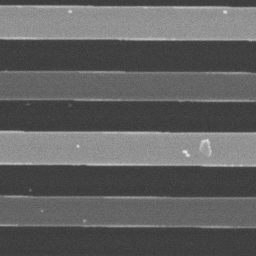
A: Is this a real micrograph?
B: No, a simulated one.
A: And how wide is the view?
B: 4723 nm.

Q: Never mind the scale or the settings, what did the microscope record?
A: lines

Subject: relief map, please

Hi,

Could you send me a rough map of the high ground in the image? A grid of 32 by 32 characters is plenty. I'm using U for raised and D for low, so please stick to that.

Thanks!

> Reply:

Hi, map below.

DDDDDDDDDDDDDDDDDDDDDDDDDDDDDDDD
UUUUUUUUUUUUUUUUUUUUUUUUUUUUUUUU
UUUUUUUUUUUUUUUUUUUUUUUUUUUUUUUU
UUUUUUUUUUUUUUUUUUUUUUUUUUUUUUUU
UUUUUUUUUUUUUUUUUUUUUUUUUUUUUUUU
DDDDDDDDDDDDDDDDDDDDDDDDDDDDDDDD
DDDDDDDDDDDDDDDDDDDDDDDDDDDDDDDD
DDDDDDDDDDDDDDDDDDDDDDDDDDDDDDDD
DDDDDDDDDDDDDDDDDDDDDDDDDDDDDDDD
UUUUUUUUUUUUUUUUUUUUUUUUUUUUUUUU
UUUUUUUUUUUUUUUUUUUUUUUUUUUUUUUU
UUUUUUUUUUUUUUUUUUUUUUUUUUUUUUUU
DDDDDDDDDUUUUUUUUUUUUUUUUUUUUUUU
DDDDDDDDDDDDDDDDDDDDDDDDDDDDDDDD
DDDDDDDDDDDDDDDDDDDDDDDDDDDDDDDD
DDDDDDDDDDDDDDDDDDDDDDDDDDDDDDDD
UUUDDDDDDDDDDDDDDDDDDDDDDDDDDDDD
UUUUUUUUUUUUUUUUUUUUUUUUUUUUUUUU
UUUUUUUUUUUUUUUUUUUUUUUUUUUUUUUU
UUUUUUUUUUUUUUUUUUUUUUUUUUUUUUUU
UUUUUUUUUUUUUUUUUUUUUUUUUUUUUUUU
DDDDDDDDDDDDDDDDDDDDDDDDDDDDDDDD
DDDDDDDDDDDDDDDDDDDDDDDDDDDDDDDD
DDDDDDDDDDDDDDDDDDDDDDDDDDDDDDDD
DDDDDDDDDDDDDDDDDDDDDDDDDDDDDDDD
UUUUUUUUUUUUUUUUUUUUUUUUUUUUUUUU
UUUUUUUUUUUUUUUUUUUUUUUUUUUUUUUU
UUUUUUUUUUUUUUUUUUUUUUUUUUUUUUUU
DDDDDDDDDDDDDDDDDDDDDDDDDDDDDDDD
DDDDDDDDDDDDDDDDDDDDDDDDDDDDDDDD
DDDDDDDDDDDDDDDDDDDDDDDDDDDDDDDD
DDDDDDDDDDDDDDDDDDDDDDDDDDDDDDDD